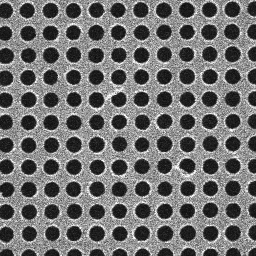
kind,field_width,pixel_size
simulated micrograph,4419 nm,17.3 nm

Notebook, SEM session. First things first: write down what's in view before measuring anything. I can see a regular array of holes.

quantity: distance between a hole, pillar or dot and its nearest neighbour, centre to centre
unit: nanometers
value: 379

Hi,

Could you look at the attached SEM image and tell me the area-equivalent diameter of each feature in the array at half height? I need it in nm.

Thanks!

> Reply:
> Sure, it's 268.